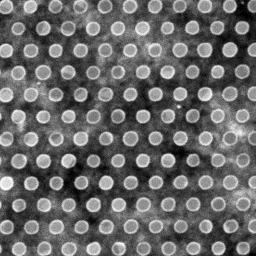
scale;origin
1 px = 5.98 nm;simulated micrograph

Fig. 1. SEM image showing a regular array of raised bodies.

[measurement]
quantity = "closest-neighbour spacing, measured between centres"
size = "148 nm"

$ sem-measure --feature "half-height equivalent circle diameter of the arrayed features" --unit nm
79.4